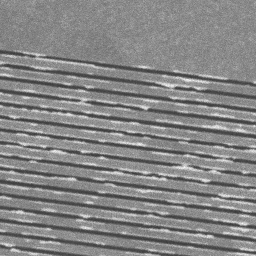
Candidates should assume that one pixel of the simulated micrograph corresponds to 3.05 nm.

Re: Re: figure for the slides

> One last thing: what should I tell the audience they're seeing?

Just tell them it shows parallel lines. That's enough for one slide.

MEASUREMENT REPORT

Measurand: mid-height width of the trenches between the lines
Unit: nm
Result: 12.1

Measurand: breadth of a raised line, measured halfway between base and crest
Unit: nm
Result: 26.9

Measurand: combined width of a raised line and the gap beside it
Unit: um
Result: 0.0393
